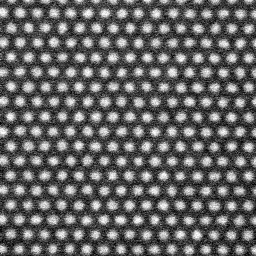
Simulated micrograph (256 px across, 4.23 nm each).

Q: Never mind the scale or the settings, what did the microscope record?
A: a regular array of raised bodies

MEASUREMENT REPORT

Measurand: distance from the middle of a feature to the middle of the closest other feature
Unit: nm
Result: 70.1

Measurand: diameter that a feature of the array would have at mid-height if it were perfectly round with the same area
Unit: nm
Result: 30.9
